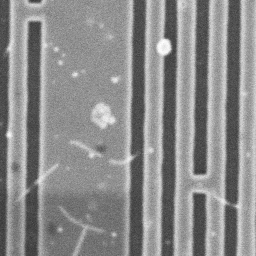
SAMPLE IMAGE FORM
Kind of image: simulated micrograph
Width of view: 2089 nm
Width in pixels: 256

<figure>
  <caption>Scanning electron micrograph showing groups of lines, slits or small figures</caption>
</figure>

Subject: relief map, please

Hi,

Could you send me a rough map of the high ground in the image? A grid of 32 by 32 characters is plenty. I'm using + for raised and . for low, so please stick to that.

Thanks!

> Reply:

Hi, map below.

.+++.++++++++++++.++..++..++..++
.++++++++++++++++.++..++..++..++
.++++++++++++++++.++..++..++..++
.++..+++++++++++..++..++..++..++
.++..+++++++++++..+++.++..++..++
.++..+++++++++++..+++.++..++..++
.++..+++++++++++..+++.++..++..++
.++..+++++++++++..++..++..++..++
.++..+++++++++++..++..++..++..++
.++..+++++++++++..++..++..++..++
.++..+++++++++++..++..++..++..++
.++..+++++++++++..++..++..++..++
.++..+++++++++++..++..++..++..++
.++..+++++++++++..++..++..++..++
.++..+++++++++++..++..++..++..++
.++..+++++++++++..++..++..++..++
.++..+++++++++++..++..++..++..++
.++..+++++++++++..++..++..++..++
.++..+++++++++++..++..++..++..++
.++..+++++++++++..++..++..++..++
.++..+++++++++++..++..++..++..++
.++..+++++++++++..++..++..++..++
.++..+++++++++++..++..++++++..++
.++..+++++++++++..++..++++++..++
.++..+++++++++++..++..++..++..++
.++..+++++++++++..++..++..++..++
.++..+++++++++++..++..++..++..++
.++..+++++++++++..++..++..++..++
.++..+++++++++++..++..++..++..++
.++..+++++++++++..++..++..++..++
.++..+++++++++++..++..++..++..++
.++..+++++++++++..++..++..++..++